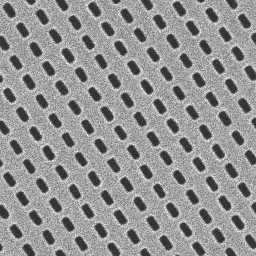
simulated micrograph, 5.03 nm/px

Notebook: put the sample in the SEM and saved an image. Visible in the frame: a regular array of holes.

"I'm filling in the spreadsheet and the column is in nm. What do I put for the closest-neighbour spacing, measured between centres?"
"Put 117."